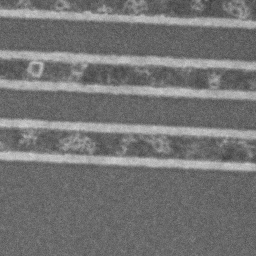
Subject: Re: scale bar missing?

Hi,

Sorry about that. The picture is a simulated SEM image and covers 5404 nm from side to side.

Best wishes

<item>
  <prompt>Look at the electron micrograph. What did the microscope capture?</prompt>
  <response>one or a few lines or trenches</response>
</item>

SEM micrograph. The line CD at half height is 0.656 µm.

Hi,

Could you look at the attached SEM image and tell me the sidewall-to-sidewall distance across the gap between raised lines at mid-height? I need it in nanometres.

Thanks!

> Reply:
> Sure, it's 849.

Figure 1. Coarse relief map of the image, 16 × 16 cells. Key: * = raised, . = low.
****************
................
................
**..............
****************
.....***********
................
................
****************
****************
................
................
................
................
................
................